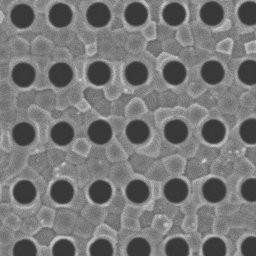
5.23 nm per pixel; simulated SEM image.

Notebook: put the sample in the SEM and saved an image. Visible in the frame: a regular array of holes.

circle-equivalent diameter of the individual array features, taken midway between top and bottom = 123 nanometres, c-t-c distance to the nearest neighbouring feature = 37.6 px